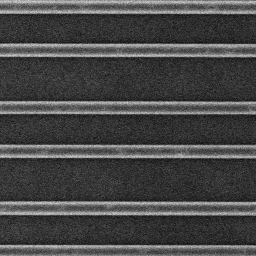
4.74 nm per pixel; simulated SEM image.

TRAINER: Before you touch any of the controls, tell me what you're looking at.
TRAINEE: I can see parallel lines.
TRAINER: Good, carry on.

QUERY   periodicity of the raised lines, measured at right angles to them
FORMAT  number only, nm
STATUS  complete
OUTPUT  238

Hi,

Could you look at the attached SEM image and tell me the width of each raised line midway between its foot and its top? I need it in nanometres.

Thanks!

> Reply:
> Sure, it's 56.9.